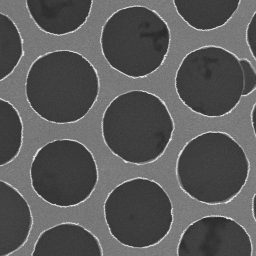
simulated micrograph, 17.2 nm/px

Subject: holes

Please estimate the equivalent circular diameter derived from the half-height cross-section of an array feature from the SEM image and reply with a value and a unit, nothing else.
1.19 um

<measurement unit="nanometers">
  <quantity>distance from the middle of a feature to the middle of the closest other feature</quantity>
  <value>1470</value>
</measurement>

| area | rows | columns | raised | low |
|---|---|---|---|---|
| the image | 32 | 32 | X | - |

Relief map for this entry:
XXX--------XXXXXXXXXXX--------XX
XXXX-------XXXX----XXX-------XXX
-XXX-------XXX------XXX-----XXX-
--XXX-----XXX--------XXX---XXXX-
--XXXXXXXXXXX--------XXXXXXXXXX-
---XXXXXXXXXX--------XXXXXXXXXX-
---XXXX--XXXX--------XXX----XXXX
--XXX------XX-------XXX-------XX
--XX--------XX------XX----------
-XX---------XXXX--XXXX----------
XXX---------XXXXXXXXXX----------
XXX---------XXXX--XXXX---------X
XXXX--------XX------XXX-------XX
--XX-------XX--------XXX-----XXX
--XXX-----XXX--------XXXXX-XXXXX
---XXXXXXXXXX---------XXXXXXXXXX
---XXXXXXXXXX--------XXXXXXXXXXX
---XXXXXXXXXX--------XXX-----XXX
--XXX------XXX-------XX-------XX
--XXX------XXXX-----XXX--------X
-XXX--------XXXXXXXXXX---------X
XXXX--------XXXXXXXXXX---------X
XXXX--------XXXXX-XXXX---------X
-XXX--------XXX-----XXX-------XX
---XX------XXX-------XXX-----XXX
---XXXX--XXXX--------XXXXXXXXXXX
----XXXXXXXXX--------XXXXXXXXXXX
----XXXXXXXXX--------XXXX----XXX
----XXX---XXXX-------XXX------XX
---XX-------XX-------XX--------X
---XX-------XXXX---XXX---------X
-XXX---------XXXXXXXXX---------X